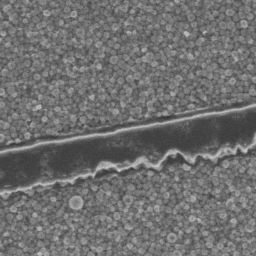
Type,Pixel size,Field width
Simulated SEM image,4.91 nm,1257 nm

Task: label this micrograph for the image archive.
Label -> one or a few lines or trenches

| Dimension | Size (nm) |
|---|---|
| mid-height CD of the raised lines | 195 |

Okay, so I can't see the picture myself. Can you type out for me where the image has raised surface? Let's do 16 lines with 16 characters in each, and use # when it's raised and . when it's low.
................
................
................
................
................
................
................
...........#####
.....###########
##############..
########........
###.............
................
................
................
................